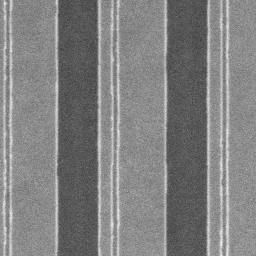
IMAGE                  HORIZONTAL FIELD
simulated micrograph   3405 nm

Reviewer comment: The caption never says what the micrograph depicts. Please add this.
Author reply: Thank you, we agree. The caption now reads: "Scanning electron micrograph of lines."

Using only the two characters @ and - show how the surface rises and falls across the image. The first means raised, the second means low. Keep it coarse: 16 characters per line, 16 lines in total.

@@@@--@@@@---@@@
@@@@--@@@@---@@@
@@@@--@@@@---@@@
@@@@--@@@@---@@@
@@@@--@@@@---@@@
@@@@--@@@@---@@@
@@@@--@@@@---@@@
@@@@--@@@@---@@@
@@@@--@@@@---@@@
@@@@--@@@@---@@@
@@@@--@@@@---@@@
@@@@--@@@@---@@@
@@@@--@@@@---@@@
@@@@--@@@@---@@@
@@@@--@@@@---@@@
@@@@--@@@@---@@@